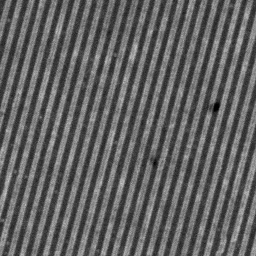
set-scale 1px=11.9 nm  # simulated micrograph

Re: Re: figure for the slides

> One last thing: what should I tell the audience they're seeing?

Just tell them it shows parallel lines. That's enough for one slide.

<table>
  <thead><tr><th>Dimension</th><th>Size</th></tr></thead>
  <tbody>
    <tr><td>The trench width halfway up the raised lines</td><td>76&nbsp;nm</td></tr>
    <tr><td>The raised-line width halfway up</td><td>0.053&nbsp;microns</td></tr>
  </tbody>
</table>